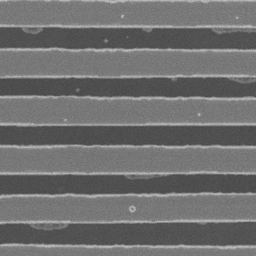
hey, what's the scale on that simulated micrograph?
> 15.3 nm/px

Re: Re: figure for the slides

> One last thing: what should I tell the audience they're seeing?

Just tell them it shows lines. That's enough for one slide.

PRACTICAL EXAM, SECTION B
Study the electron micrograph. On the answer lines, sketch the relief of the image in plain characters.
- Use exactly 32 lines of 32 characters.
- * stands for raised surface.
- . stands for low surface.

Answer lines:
********************************
********************************
********************************
................................
................................
................................
********************************
********************************
********************************
********************************
................................
................................
********************************
********************************
********************************
********************************
................................
................................
********************************
********************************
********************************
********************************
................................
................................
********************************
********************************
********************************
********************************
................................
................................
................................
********************************